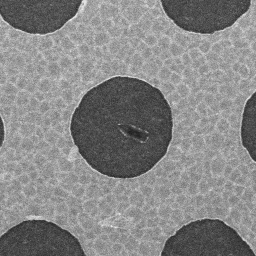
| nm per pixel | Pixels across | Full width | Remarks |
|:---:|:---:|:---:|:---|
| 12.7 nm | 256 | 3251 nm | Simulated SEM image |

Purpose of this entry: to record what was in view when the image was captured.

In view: holes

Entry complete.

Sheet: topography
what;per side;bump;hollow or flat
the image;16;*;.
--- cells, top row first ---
.....*****......
*...*******....*
****************
****************
****************
******....******
*****......****.
****.......****.
****....*..****.
*****.....*****.
******....******
****************
****************
****************
....*******....*
.....*****......